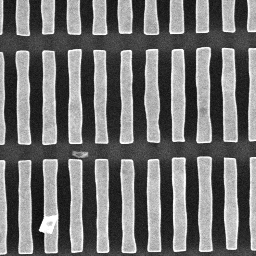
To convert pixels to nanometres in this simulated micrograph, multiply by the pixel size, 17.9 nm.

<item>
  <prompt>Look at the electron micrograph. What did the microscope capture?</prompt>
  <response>groups of lines, slits or small figures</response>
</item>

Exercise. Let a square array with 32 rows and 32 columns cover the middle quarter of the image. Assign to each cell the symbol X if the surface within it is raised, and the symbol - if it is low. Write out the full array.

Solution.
-XXX----XX----XXX---XXX----XXX--
-XXX----XX----XXX---XXX----XXX--
-XXX----XX----XXX---XXX----XXX--
--XX----XXX---XXX---XXX----XXX--
--XX----XXX---XXX---XXX----XXX--
--XX----XXX---XXX---XXX----XXX--
--XX----XXX---XXX---XXXX---XXX--
--XX----XXX---XXX---XXXX---XXX--
--XX----XX----XXX---XXXX---XXX--
-XXX----XX----XXX---XXXX---XXX--
-XXX----XX----XXX---XXXX---XXX--
-XXX----XX----XXX---XXXX---XXX--
-XXX----XX----XXX----XXX---XXX--
-XXX----XX----XXX----XXX---XXX--
-XXX----XXX---XXX----XX----XXX--
-XXX----XXX---XXX----XXX---XXX--
-XXX----XXX---XXX----XXX---XXX--
-XXX----XXX---XXX----XXX---XXX--
-XXX----XXX---XXX----XXX---XXX--
-XXX----XXX---XXX---------------
--------------------------------
--------------------------------
--------------------------------
--------------------------------
-XXX----XXX---XXX----XXX---XXX--
-XXX----XXX---XXX----XXX---XXX--
-XXX----XXX---XXX----XXX---XXX--
--XX----XXX---XXX----XXX---XXX--
--XX----XXX---XXX----XXX---XXX--
--XX----XXX---XXX----XXX---XXX--
--XX----XXX---XXX----XXX---XXX--
--XX----XXX---XXX----XXX---XXX--